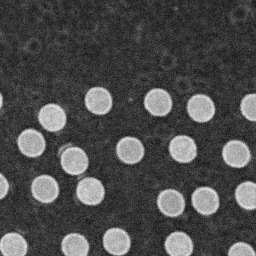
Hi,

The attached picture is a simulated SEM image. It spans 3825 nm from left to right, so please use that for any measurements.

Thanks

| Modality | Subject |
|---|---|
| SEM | a regular array of raised bodies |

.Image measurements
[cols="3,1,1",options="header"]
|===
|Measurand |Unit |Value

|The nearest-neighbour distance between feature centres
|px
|41.6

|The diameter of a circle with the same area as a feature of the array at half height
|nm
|396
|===